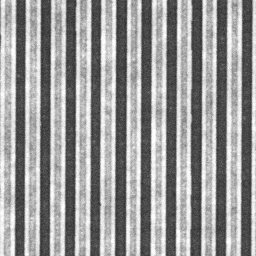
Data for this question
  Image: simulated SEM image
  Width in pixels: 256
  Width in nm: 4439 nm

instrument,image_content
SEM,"parallel lines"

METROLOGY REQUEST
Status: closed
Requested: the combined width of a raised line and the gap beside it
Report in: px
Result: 25.2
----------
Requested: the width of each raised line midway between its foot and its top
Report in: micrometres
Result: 0.195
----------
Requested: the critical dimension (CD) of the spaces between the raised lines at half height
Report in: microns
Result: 0.245